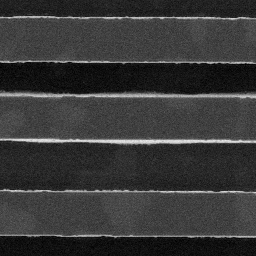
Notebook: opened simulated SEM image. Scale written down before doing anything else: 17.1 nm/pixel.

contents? lines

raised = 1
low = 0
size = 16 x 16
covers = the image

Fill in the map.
0000000000000000
1111111111111111
1111111111111111
1111111111111111
0000000000000000
0000000000000000
1111111111111111
1111111111111111
1111111111111111
0000000000000000
0000000000000000
0000000000000000
1111111111111111
1111111111111111
1111111111111111
0000000000000000